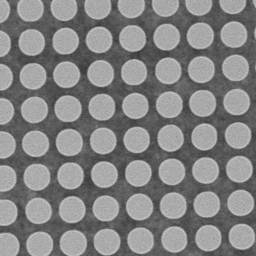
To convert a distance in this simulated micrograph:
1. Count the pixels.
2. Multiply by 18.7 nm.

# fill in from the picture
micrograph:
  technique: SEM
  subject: an array of small figures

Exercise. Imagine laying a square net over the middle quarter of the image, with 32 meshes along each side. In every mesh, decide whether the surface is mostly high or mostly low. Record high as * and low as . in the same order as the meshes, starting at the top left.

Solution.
***....*****...*****...******..*
****..******..*******..******..*
****..******..*******..******..*
****..******...*****...******...
***....*****...*****....****....
**.......*......................
................................
.................**.....****....
***....*****...*****....*****...
****..*******..******..******..*
****..*******..******..******..*
****..*******..******..******...
****...*****...*****....*****...
***.....***......**.............
................................
..........................**....
***.....****....****....*****...
****...*****...******...******..
****...******..******..*******..
*****..******..******..*******..
****...******..******...*****...
****...*****....****.....***....
***......*......................
................................
..........*......***.....****...
****....*****...*****...******..
*****..******..*******..******..
*****..******..*******..******..
*****..******...*****...******..
*****..******...*****....****...
****.....***......*.............
................................